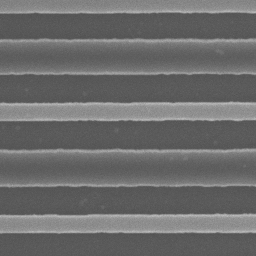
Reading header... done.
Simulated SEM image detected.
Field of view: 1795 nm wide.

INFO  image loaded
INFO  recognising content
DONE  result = lines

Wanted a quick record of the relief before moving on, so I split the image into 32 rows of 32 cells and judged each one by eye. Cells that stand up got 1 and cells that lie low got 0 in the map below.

11111111111111111111111111111111
11111111111111111111111111111111
00000000000000000000000000000000
00000000000000000000000000000000
00000000000000000000000000000000
11111111111111111111111111111111
11111111111111111111111111111111
11111111111111111111111111111111
11111111111111111111111111111111
00000000000000000000000000000000
00000000000000000000000000000000
00000000000000000000000000000000
00000000000000000000000000000000
11111111111111111111111111111111
11111111111111111111111111111111
00000000000000000000000000000000
00000000000000000000000000000000
00000000000000000000000000000000
00000000000000000000000000000000
11111111111111111111111111111111
11111111111111111111111111111111
11111111111111111111111111111111
11111111111111111111111111111111
00000000000000000000000000000000
00000000000000000000000000000000
00000000000000000000000000000000
00000000000000000000000000000000
11111111111111111111111111111111
11111111111111111111111111111111
00000000000000000000000000000000
00000000000000000000000000000000
00000000000000000000000000000000